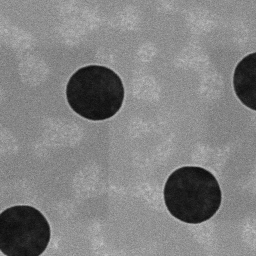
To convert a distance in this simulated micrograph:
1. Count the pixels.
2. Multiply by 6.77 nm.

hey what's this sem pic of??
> holes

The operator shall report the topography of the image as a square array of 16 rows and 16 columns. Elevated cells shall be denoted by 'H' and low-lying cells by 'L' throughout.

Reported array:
HHHHHHHHHHHHHHHH
HHHHHHHHHHHHHHHH
HHHHHHHHHHHHHHHH
HHHHHHHHHHHHHHHL
HHHHHLLHHHHHHHHL
HHHHLLLLHHHHHHHL
HHHHLLLLHHHHHHHL
HHHHHHHHHHHHHHHH
HHHHHHHHHHHHHHHH
HHHHHHHHHHHHHHHH
HHHHHHHHHHHLHHHH
HHHHHHHHHHLLLLHH
HHHHHHHHHHLLLLHH
LLLHHHHHHHHLLHHH
LLLHHHHHHHHHHHHH
LLLHHHHHHHHHHHHH